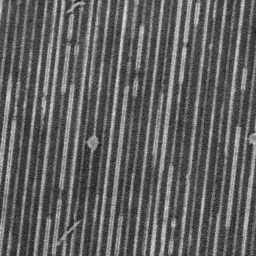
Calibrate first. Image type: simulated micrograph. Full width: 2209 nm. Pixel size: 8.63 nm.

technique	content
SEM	parallel lines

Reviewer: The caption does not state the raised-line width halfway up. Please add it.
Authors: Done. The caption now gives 0.0161 micrometres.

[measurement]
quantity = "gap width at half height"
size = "65.4 nm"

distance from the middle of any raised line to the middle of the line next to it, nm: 77